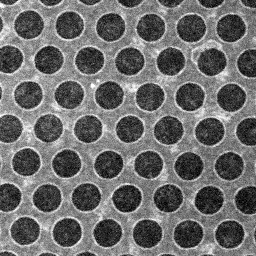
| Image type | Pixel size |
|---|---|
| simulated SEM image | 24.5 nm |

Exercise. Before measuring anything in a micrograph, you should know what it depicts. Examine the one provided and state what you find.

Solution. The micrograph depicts a regular array of holes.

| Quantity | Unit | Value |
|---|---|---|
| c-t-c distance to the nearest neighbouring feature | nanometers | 957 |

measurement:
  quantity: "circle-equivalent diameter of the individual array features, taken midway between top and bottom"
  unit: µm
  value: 0.728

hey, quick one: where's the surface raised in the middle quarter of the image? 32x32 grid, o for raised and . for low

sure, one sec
ooo.......ooo.......ooo.......oo
ooo......oooo.......oooo......oo
ooooo...oooooo....oooooo.....ooo
oooooooooooooooooooooooooooooooo
...ooooooo...ooooooooooooooooooo
....oooo......ooooo.....ooooo...
.....ooo.......ooo.......ooo....
.....oo........ooo.......ooo....
.....ooo.......ooo.......ooo....
.....ooo.......ooo.......ooo....
....ooooo.....oooo......ooooo...
o.ooooooooo.ooooooo....ooooooo..
oooooooooooooooooooooooooooooooo
oooo.....ooooo.....ooooo....oooo
ooo......oooo.......ooo......ooo
oo........ooo.......oo........oo
oo........ooo.......oo........oo
ooo.......ooo.......oo........oo
ooo......ooooo.....oooo.......oo
oooo....ooooooo...oooooo.....ooo
oooooooooooooooooooooooooooooooo
..ooooooooo.oooooooooooooooooooo
....ooooo.....ooooo.....ooooo...
....oooo.......ooo......oooo....
....oooo.......oo........ooo....
....ooo........oo........oo.....
....oooo.......ooo.......ooo....
...ooooo......oooo......oooo....
.ooooooooo...ooooooo...oooooo...
oooooooooooooooooooooooooooooooo
ooo.....oooooo....oooooo....oooo
oo.......oooo......oooo......ooo